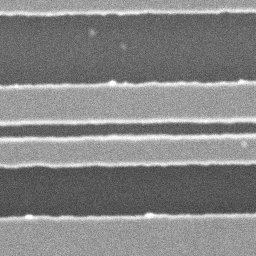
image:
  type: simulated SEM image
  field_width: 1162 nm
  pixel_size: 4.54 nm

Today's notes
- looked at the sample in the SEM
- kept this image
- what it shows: lines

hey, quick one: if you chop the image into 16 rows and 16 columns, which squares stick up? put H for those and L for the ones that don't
HHHHHHHHHHHHHHHH
LLLLLLLLLLLLLLLL
LLLLLLLLLLLLLLLL
LLLLLLLLLLLLLLLL
LLLLLLLLLLLLLLLL
HHHHHHHHHHHHHHHH
HHHHHHHHHHHHHHHH
HHHHHHHHHHHHHHHH
HHHHHHHHHHHHHHHH
HHHHHHHHHHHHHHHH
LLLLLLLLLLLLLLLL
LLLLLLLLLLLLLLLL
LLLLLLLLLLLLLLLL
LLLLLLLLLHHHHHHH
HHHHHHHHHHHHHHHH
HHHHHHHHHHHHHHHH